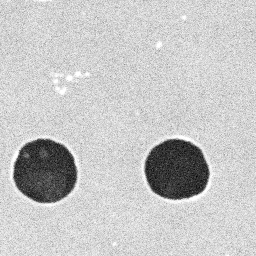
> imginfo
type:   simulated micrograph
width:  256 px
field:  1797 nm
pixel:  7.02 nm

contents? holes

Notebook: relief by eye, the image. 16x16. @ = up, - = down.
@@@@@@@@@@@@@@@@
@@@@@@@@@@@@@@@@
@@@@@@@@@@@@@@@@
@@@@@@@@@@@@@@@@
@@@@@@@@@@@@@@@@
@@@@@@@@@@@@@@@@
@@@@@@@@@@@@@@@@
@@@@@@@@@@@@@@@@
@@@@@@@@@@@@@@@@
@---@@@@@----@@@
@----@@@@----@@@
@----@@@@----@@@
@@--@@@@@@@@@@@@
@@@@@@@@@@@@@@@@
@@@@@@@@@@@@@@@@
@@@@@@@@@@@@@@@@